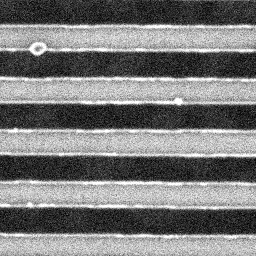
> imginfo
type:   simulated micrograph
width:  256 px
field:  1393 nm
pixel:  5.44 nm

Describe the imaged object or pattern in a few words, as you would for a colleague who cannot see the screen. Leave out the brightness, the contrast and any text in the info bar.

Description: lines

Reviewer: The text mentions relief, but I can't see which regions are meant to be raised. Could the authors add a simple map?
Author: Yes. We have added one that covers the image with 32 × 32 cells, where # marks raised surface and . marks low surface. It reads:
################################
################################
################################
................................
................................
....#...........................
################################
################################
################################
################################
................................
................................
......................#.........
################################
################################
################################
................................
................................
................................
################################
################################
################################
################################
................................
................................
................................
################################
################################
################################
..............##################
................................
................................